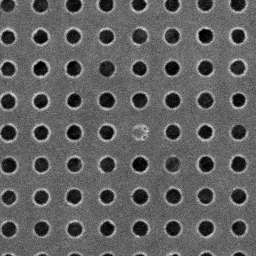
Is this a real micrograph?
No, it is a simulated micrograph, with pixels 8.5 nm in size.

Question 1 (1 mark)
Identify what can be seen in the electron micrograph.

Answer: a regular array of holes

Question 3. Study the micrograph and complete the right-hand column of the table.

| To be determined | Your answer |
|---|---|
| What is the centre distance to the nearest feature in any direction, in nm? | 272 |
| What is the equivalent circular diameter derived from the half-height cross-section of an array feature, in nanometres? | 130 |